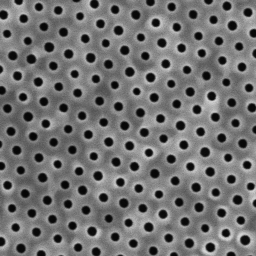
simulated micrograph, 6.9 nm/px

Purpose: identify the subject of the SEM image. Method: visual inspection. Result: a regular array of holes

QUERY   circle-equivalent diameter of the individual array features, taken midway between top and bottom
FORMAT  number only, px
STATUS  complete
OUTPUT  8.96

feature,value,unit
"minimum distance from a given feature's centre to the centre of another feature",0.137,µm